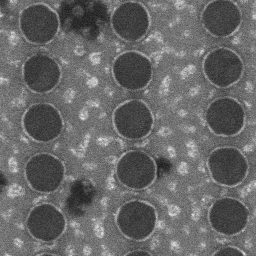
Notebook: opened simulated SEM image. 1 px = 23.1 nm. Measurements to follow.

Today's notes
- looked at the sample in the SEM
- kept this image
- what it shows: a regular array of raised bodies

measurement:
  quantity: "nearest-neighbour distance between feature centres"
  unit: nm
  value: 1140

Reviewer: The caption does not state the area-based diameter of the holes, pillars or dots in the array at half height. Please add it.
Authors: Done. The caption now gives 931 nm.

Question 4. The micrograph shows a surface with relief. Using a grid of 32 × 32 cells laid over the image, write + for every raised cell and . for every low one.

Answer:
....++.........+++........+++...
...++++.......++++.......+++++..
...++++.......+++++......+++++..
...++++.......+++++.......++++..
...++++........+++.........++...
................................
................+.........+++...
...++++.......+++++.......++++..
...++++.......+++++......+++++..
...+++++......+++++.......++++..
...++++........++++........++...
....++..........................
................+..........+++..
....+++........++++.......++++..
...+++++......+++++.......+++++.
...+++++......+++++.......+++++.
...+++++.......++++........+++..
....+++.........................
...........................++...
....+++........++++.......+++++.
...+++++.......++++.......+++++.
...+++++.......+++++......+++++.
...+++++.......++++........+++..
....+++.........++..............
................................
.....+.........+++.........+++..
....++++.......+++++......+++++.
...+++++.......+++++......+++++.
...+++++.......++++........+++..
....++++........+++.............
................................
................++.........+++..